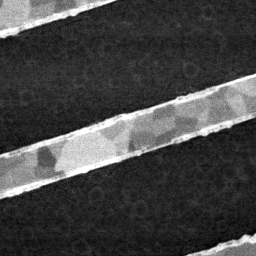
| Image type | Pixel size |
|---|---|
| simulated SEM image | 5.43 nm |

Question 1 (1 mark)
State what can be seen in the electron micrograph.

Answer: one or a few lines or trenches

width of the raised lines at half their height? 228 nm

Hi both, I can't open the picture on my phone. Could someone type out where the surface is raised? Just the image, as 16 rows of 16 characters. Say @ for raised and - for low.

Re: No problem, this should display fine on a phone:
@@@@@@----------
@@@-------------
----------------
----------------
----------------
-------------@@@
----------@@@@@@
-------@@@@@@@@-
----@@@@@@@@----
-@@@@@@@@-------
@@@@@@----------
@@@-------------
----------------
----------------
----------------
-------------@@@